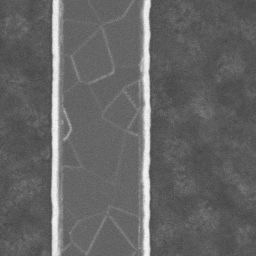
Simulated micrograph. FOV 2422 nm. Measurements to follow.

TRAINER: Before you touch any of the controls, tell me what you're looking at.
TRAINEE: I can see one or a few lines or trenches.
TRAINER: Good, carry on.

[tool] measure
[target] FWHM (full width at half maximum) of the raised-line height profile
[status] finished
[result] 865 nm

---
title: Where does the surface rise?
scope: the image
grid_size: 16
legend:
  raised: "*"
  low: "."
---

....*****.......
...******.......
...******.......
....*****.......
....*****.......
...******.......
...******.......
...******.......
...******.......
...******.......
...******.......
...******.......
...******.......
...******.......
...******.......
...******.......